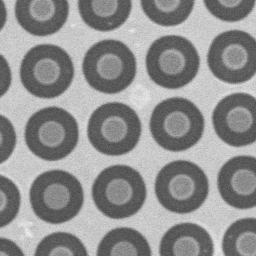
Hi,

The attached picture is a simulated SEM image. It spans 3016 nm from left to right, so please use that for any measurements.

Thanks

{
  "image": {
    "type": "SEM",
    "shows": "an array of small figures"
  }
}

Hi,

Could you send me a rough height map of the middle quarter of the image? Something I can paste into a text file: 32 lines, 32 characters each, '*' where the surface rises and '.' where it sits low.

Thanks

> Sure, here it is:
..**.....*****....**....******..
...**....*****....***....****...
...**....*****....***.....**....
..***......*......***...........
..****...........*****..........
.*****..........********......**
.*******.......*****************
**********...*******************
**************************....**
***********...**********........
*********.......*******.........
*******..........*****..........
..*****...........****.....***..
...***.............***....*****.
...***....*****....**....******.
....**....*****....**....******.
....*.....*****....**.....*****.
....**....*****....***....****..
....**....****.....***..........
...***.............****.........
...****...........******........
..******.........********.....**
.********.......****************
********************************
**************************......
***********.....*********.......
*********.........******........
..*******..........****.........
...*****............***.....***.
....***.....****....***....*****
....***....*****.....**....*****
*....**....******....*.....*****